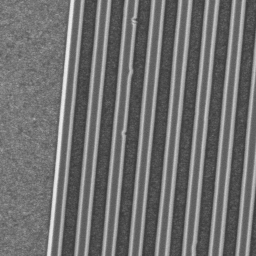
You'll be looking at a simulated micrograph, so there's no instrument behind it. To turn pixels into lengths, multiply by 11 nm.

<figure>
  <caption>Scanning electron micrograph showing parallel lines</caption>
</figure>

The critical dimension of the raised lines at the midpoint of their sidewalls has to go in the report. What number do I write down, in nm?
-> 123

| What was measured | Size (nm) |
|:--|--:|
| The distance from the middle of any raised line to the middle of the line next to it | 294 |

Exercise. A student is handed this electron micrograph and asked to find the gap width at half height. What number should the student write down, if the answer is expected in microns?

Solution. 0.171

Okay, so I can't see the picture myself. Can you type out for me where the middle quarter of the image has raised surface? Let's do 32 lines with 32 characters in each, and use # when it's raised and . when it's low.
###....###....###....##.....##..
###....###....###....##....###..
###....###....###....##....###..
###....###....##.....##....###..
###....###....##....###....###..
###....###....##....###....###..
###....##.....##....###....###..
###....##....###....###....##...
###...###....###....###....##...
##....###....###....###....##...
##....###....###....###....##...
##....###....###....##....###...
##....###....###...###....###...
##....###....###...###....###...
##....###....##.....##....###...
##....###....##....###....###...
##....###....##....###....###...
##....##.....##....###....###...
##....##....###....###....##....
##...###....###....###....##....
#....###....###....###....##....
#....###....###....##.....##....
#....###....###....##....###....
#....###....###....##....###....
#....###....###....##....###....
#....###....##....###....###....
#....###....##....###....###....
#....###....##....###....###....
#....##.....##....###....###....
#...###....###....###....##.....
#...###....###....###....##....#
....###....###....###....##....#